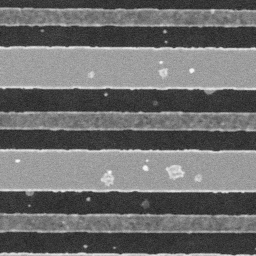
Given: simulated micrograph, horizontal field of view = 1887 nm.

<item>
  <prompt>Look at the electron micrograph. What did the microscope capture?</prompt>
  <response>lines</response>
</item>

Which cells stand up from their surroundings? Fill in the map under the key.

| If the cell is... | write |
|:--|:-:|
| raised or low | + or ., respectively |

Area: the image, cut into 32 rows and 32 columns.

................................
++++++++++++++++++++++++++++++++
++++++++++++++++++++++++++++++++
................................
................................
................................
++++++++++++++++++++++++++++++++
++++++++++++++++++++++++++++++++
++++++++++++++++++++++++++++++++
++++++++++++++++++++++++++++++++
++++++++++++++++++++++++++++++++
................................
................................
................................
++++++++++++++++++++++++++++++++
++++++++++++++++++++++++++++++++
................................
................................
................................
++++++++++++++++++++++++++++++++
++++++++++++++++++++++++++++++++
++++++++++++++++++++++++++++++++
++++++++++++++++++++++++++++++++
++++++++++++++++++++++++++++++++
................................
................................
................................
++++++++++++++++++++++++++++++++
++++++++++++++++++++++++++++++++
................................
................................
................................